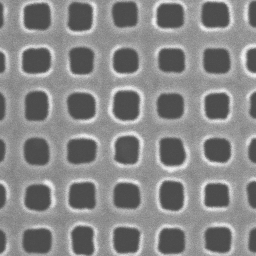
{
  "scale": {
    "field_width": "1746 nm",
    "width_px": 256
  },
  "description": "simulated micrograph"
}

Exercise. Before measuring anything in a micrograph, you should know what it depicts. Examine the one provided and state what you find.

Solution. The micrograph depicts a regular array of holes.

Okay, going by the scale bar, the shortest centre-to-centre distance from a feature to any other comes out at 302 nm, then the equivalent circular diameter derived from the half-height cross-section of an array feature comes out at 196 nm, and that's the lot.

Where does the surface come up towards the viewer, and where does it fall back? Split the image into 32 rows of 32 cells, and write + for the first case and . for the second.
++++..+++..+++...+++..++++..+++.
+++...+++...++...++....++....++.
+++...++....++...+++...++....++.
+++...+++..+++++++++..++++++++++
++++++++++++++++++++++++++++++++
++++++++++++++++++++++++++++++++
+++...+++...++...+++...++....++.
.++...+++...++...+++...++....++.
.++...+++...++...+++...++....++.
++++++++++++++++++++++++++++++++
++++++++++++++++++++++++++++++++
++++.++++++++++..+++++++++++++++
.++...++....++...+++...+++...++.
.++...++....++...+++...+++...++.
.++...+++...++...+++...+++..+++.
++++++++++++++++++++++++++++++++
++++++++++++++++++++++++++++++++
+++...+++...+++..+++...+++..++++
.++...++....++...+++...++....++.
.++...++....++...+++...+++...++.
++++..+++++++++..+++...+++++++++
++++++++++++++++++++++++++++++++
++++++++++++++++++++++++++++++++
.++...+++...++...+++...+++...++.
.++...++....++....++...++....++.
.++...+++...++...+++...+++...++.
++++++++++++++++++++++++++++++++
++++++++++++++++++++++++++++++++
+++++++++..++++..++++.++++..++++
.++....++...++....++...++....++.
.++...+++...++...+++...+++...++.
+++...+++...+++..+++...+++..++++